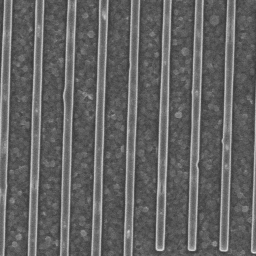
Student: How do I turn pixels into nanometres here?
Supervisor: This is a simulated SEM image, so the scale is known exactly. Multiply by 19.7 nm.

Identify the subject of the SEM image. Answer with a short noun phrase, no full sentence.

parallel lines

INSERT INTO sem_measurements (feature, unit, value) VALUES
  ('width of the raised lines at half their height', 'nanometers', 165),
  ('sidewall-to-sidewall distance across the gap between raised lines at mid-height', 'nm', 462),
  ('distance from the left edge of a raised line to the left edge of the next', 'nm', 627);